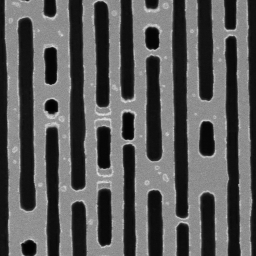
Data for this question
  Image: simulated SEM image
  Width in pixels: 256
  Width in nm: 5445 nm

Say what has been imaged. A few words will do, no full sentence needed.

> parallel lines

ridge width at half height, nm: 290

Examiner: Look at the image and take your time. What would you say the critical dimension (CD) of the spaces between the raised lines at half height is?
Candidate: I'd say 0.253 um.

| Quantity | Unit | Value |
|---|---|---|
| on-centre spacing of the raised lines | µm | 0.543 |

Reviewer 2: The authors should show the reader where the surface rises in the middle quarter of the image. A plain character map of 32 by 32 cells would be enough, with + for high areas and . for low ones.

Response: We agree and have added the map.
++...+++...+++...++++...+++....+
++...+++...+++...++++...+++....+
++...+++...+++...++++...+++....+
++...+++...+++...++++...+++....+
++...+++...+++...++++...+++....+
++...+++...+++...++++...+++....+
++...+++...+++...++++...+++....+
++...+++...++++..++++...+++....+
++...+++...++++.+++++...+++....+
++...+++...++++++++++...+++....+
++...++++.+++++++++++...+++....+
++...++++++++++++++++...++++...+
++...++++++++++..++++...++++...+
+....++++++++++..++++...++++...+
+....++++++++++..++++...++++...+
+....++++++++++..++++...++++...+
++...+++...++++..++++...++++...+
++...++++...+++..++++...++++...+
++...++++...+++..++++...++++...+
++...++++...+++++++++...++++...+
++...+++....+++..++++...++++...+
++...+++....+++...+++....+++...+
++...+++...++++...+++...++++...+
++...+++...++++...+++...++++...+
++...+++...++++...++++++++++...+
++...++++..++++...++++++++++...+
++...++++++++++...++++++++++...+
++...++++++++++...++++++++++...+
++...++++++++++..+++++++++++...+
++...++++++++++..+++++++++++...+
++...++++++++++..+++++++++++...+
+++++++++..++++..+++++++++++...+